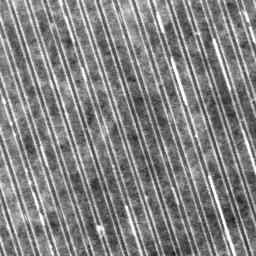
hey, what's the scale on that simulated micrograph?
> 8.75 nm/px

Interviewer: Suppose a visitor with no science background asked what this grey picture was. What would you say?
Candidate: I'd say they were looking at parallel lines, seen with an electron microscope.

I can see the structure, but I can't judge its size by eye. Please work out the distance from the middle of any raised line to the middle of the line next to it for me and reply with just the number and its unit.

147 nanometres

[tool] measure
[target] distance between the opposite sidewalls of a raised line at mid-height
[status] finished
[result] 109 nm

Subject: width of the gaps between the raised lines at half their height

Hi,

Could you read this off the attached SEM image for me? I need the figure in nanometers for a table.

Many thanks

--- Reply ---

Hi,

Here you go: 38.5